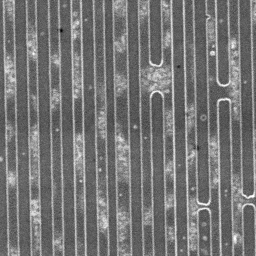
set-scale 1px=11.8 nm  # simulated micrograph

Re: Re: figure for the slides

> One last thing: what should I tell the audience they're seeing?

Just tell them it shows parallel lines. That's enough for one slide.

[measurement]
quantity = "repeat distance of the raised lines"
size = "0.264 micrometres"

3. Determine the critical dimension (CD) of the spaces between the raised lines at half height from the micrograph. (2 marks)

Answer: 140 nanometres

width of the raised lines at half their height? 129 nanometers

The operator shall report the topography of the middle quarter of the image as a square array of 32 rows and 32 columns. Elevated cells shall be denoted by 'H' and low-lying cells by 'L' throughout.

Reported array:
LLHHLLLLHHLLLHHHLLLHHHHHHHHLLLHH
LLHHHLLLHHLLLHHHLLLHHHHHHHHLLLHH
LLHHHLLLHHLLLHHHLLLHHHHHHHHLLLHH
LLHHHLLLHHLLLHHHLLLHHHHHHHHLLLHH
LLHHHLLLHHLLLHHHLLLHHHHHHHHLLLHH
LLHHHLLLHHLLLHHHLLLHHHHHHHHLLLHH
LLHHHLLLHHLLLHHHLLLHHHHHHHHLLLHH
LLHHHLLLHHLLLHHHLLLHHHLLHHHLLLLH
LLHHHLLLHHLLLHHHLLLHHHLLLHHLLLLH
LLHHHLLLHHLLLHHHLLLHHHLLLHHLLLLH
LLHHHLLLHHLLLHHHLLLHHHLLLHHLLLHH
LLHHHLLLHHLLLHHHLLLHHHLLLHHLLLHH
LLHHHLLLHHLLLHHHLLLHHHLLLHHLLLHH
LLHHHLLLHHLLLHHHLLLHHHLLLHHLLLHH
LLHHHLLLHHLLLHHHLLLHHHLLLHHLLLLH
LLHHHLLLHHHLLHHHLLLHHHLLLHHLLLLH
LLLHHLLLHHHLLHHHLLLHHHLLLHHLLLHH
LLLHHLLLHHHLLHHHLLLHHHLLLHHLLLHH
LLLHHLLLHHHLLHHHLLLHHHLLLHHLLLLH
LLLHHLLLHHHLLHHHLLLHHHLLLHHLLLLH
LLLHHLLLHHHLLHHHLLLHHHLLLHHLLLLH
LLLHHLLLHHHLLHHHLLLHHHLLLHHLLLLH
LLLHHLLLHHHLLHHHLLLHHHLLLHHLLLLH
LLLHHLLLHHHLLHHHLLLHHHLLLHHLLLLH
LLLHHLLLHHHLLHHHLLLHHHLLLHHLLLLH
LLLHHLLLHHHLLHHHLLLHHHLLLHHLLLLH
LLLHHLLLHHHLLHHHLLLHHHLLLHHLLLLH
LLLHHLLLHHHLLHHHLLLHHHLLLHHLLLLH
LLLHHLLLHHHLLHHHLLLHHHLLLHHHLLLH
LLLHHLLLHHHLLHHHHLLHHHLLLHHHLLLH
LLLHHLLLHHHLLHHHHLLLHHLLLHHHLLLH
LLLHHLLLHHHLLHHHHLLLHHLLLHHHLLLH